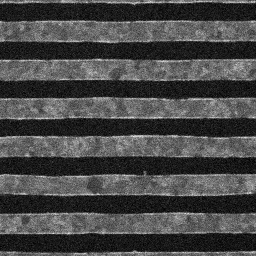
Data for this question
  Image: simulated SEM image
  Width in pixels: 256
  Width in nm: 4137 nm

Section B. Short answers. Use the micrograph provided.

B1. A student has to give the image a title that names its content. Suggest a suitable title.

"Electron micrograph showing parallel lines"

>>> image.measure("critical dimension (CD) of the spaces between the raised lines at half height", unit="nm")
313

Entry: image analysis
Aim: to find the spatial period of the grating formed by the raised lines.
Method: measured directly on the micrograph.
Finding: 621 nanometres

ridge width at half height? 19.4 px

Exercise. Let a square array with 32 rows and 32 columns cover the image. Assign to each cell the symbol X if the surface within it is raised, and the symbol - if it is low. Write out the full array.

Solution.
--------------------------------
--------------------------------
--------------------------------
XXXXXXXXXXXXXXXXXXXXXXXXXXXXXXXX
XXXXXXXXXXXXXXXXXXXXXXXXXXXXXXXX
--------------------------------
--------------------------------
--------------------------------
XXXXXXXXXXXXXXXXXXXXXXXXXXXXXXXX
XXXXXXXXXXXXXXXXXXXXXXXXXXXXXXXX
--------------------------------
--------------------------------
XXXXXXXXXXXXXXXXXXXXX---XXXXXXXX
XXXXXXXXXXXXXXXXXXXXXXXXXXXXXXXX
XXXXXXXXXXXXXXXXXXXXXXXXXXXXXXXX
--------------------------------
--------------------------------
XXXXXXXXXXXXXXXXXXXXXXXXXXXXXXXX
XXXXXXXXXXXXXXXXXXXXXXXXXXXXXXXX
XXXXXXXXXX------------X--XXXXXXX
--------------------------------
--------------------------------
XXXXXXXXXXXXXXXXXXXXXXXXXXXXXXXX
XXXXXXXXXXXXXXXXXXXXXXXXXXXXXXXX
--------------------------------
--------------------------------
--------------------------------
XXXXXXXXXXXXXXXXXXXXXXXXXXXXXXXX
XXXXXXXXXXXXXXXXXXXXXXXXXXXXXXXX
--------------------------------
--------------------------------
----------------X---------------